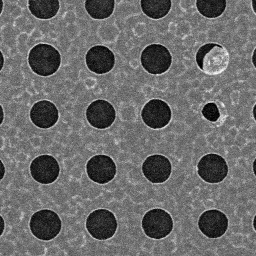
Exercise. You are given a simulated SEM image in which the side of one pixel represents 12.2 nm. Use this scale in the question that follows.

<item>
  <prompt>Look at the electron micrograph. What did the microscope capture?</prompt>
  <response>a regular array of holes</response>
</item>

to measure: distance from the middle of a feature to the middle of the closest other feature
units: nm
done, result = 669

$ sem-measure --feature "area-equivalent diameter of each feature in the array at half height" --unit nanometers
364